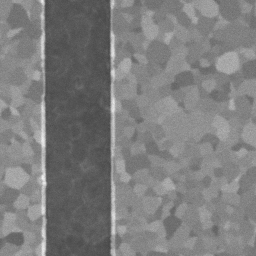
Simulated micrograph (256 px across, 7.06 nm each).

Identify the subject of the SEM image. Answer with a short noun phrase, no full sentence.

one or a few lines or trenches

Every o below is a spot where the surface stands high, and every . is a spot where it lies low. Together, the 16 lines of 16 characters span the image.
ooo....ooooooooo
ooo....ooooooooo
ooo....ooooooooo
ooo....ooooooooo
ooo....ooooooooo
ooo....ooooooooo
ooo....ooooooooo
ooo....ooooooooo
ooo....ooooooooo
ooo....ooooooooo
ooo....ooooooooo
ooo....ooooooooo
ooo....ooooooooo
ooo....ooooooooo
ooo....ooooooooo
ooo....ooooooooo